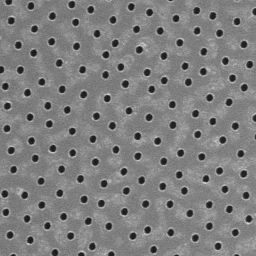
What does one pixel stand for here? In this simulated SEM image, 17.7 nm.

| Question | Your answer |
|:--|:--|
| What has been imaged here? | a regular array of holes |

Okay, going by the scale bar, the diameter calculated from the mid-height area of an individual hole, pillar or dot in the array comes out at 0.134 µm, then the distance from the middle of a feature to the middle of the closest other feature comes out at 353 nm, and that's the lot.